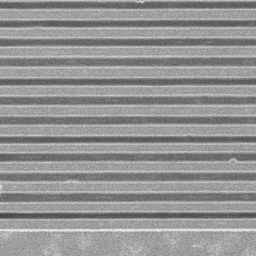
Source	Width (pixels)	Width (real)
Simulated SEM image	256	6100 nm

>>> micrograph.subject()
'parallel lines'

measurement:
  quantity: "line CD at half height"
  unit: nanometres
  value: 262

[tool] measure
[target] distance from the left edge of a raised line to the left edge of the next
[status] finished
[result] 454 nm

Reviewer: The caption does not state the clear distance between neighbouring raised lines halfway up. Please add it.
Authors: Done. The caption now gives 191 nanometres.